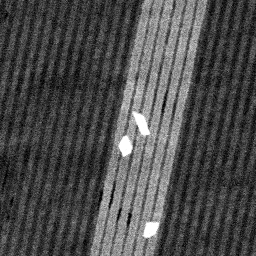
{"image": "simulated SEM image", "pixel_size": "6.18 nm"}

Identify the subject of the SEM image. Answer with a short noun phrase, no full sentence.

parallel lines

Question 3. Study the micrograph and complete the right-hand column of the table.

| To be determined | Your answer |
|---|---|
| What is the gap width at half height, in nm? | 22.6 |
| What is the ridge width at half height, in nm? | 45.4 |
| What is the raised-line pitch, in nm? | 66.8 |